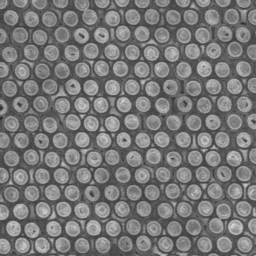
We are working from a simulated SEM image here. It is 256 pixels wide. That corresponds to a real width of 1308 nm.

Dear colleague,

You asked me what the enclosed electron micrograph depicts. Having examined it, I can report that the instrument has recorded a regular array of raised bodies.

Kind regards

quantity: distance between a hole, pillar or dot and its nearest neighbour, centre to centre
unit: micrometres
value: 0.0952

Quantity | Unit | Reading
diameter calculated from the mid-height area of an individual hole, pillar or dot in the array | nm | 71.7